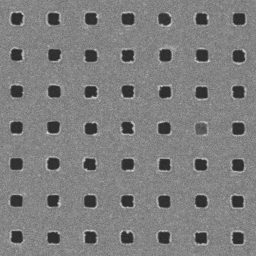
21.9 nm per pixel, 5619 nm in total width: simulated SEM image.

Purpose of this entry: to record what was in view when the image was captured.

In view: a regular array of holes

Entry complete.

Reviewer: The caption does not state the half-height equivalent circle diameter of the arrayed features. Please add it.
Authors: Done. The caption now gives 291 nanometers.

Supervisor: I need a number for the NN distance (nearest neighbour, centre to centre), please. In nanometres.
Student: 792